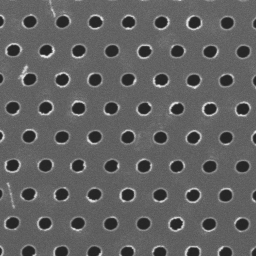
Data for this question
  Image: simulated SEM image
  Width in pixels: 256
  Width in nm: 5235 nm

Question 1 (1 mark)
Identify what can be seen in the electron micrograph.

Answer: a regular array of holes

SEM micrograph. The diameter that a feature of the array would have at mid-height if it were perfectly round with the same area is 256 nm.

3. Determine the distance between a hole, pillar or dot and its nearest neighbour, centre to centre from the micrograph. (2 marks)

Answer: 667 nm